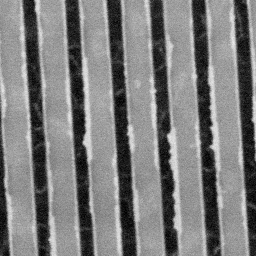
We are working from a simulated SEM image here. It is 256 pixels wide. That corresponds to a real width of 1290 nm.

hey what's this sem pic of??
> parallel lines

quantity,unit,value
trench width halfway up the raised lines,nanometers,73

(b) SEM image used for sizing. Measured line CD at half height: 137 nanometres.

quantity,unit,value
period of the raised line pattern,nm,212